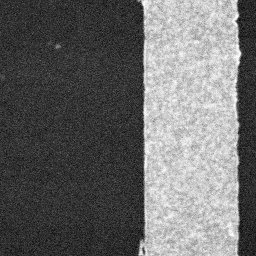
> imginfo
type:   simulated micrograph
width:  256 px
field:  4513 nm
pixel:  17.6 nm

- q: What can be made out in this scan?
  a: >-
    one or a few lines or trenches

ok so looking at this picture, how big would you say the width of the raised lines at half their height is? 1620 nm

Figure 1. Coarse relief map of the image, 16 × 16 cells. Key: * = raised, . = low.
.........******.
.........******.
.........******.
.........******.
.........******.
.........******.
.........******.
.........******.
.........******.
.........******.
.........******.
.........******.
.........******.
.........******.
.........******.
.........******.